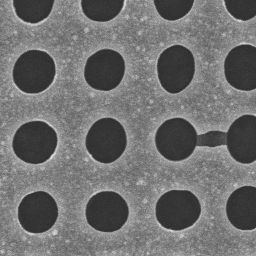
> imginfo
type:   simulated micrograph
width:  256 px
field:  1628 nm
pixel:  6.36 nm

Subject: a regular array of holes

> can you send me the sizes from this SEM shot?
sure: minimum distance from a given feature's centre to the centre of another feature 0.448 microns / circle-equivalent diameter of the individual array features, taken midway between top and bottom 272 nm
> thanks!